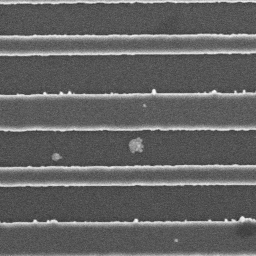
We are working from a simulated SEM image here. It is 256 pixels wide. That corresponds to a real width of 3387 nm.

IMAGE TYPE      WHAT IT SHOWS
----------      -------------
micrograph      lines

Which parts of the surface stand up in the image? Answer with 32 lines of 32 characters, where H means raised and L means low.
LLLLLLLLLLLLLLLLLLLLLLLLLLLLLLLL
LLLLLLLLLLLLLLLLLLLLLLLLLLLLLLLL
LLLLLLLLLLLLLLLLLLLLLLLLLLLLLLLL
LLLLLLLLLLLLLLLLLLLLLLLLLLLLLLLL
LLLLHLHLHHHHLHHHHHHHHHHHHHHHHHHH
HHHHHHHHHHHHHHHHHHHHHHHHHHHHHHHH
HHHHHHHHHHHHHHHHHHHHHHHHHHHHHHHH
LLLLLLLLLLLLLLLLLLLLLLLLLLLLLLLL
LLLLLLLLLLLLLLLLLLLLLLLLLLLLLLLL
LLLLLLLLLLLLLLLLLLLLLLLLLLLLLLLL
LLLLLLLLLLLLLLLLLLLLLLLLLLLLLLLL
LLLLLLLLLLLLLLLLLLLHLLLLLLLLLLLL
HHHHHHHHHHHHHHHHHHHHHHHHHHHHHHHH
HHHHHHHHHHHHHHHHHHHHHHHHHHHHHHHH
HHHHHHHHHHHHHHHHHHHHHHHHHHHHHHHH
HHHHHHHHHHHHHHHHHHHHHHHHHHHHHHHH
LLLLLLLLLLLLLLLLLLLLLLLLLLLLLLLL
LLLLLLLLLLLLLLLLLLLLLLLLLLLLLLLL
LLLLLLLLLLLLLLLLLLLLLLLLLLLLLLLL
LLLLLLLLLLLLLLLLLLLLLLLLLLLLLLLL
LLLLLLLLLLLLLLLLLLLLLLLLLLLLLLLL
HHHHHHHHHHHHHHHHHHHHHHHHHHHHHHHH
HHHHHHHHHHHHHHHHHHHHHHHHHHHHHHHH
LLLLLLLLLLLLLLLLLLLLLLLLLLLLLLLL
LLLLLLLLLLLLLLLLLLLLLLLLLLLLLLLL
LLLLLLLLLLLLLLLLLLLLLLLLLLLLLLLL
LLLLLLLLLLLLLLLLLLLLLLLLLLLLLLLL
LLLLLLLLLLLLLLLLLLLLLLLLLLLLLLHH
HHHHHHHHHHHHHHHHHHHHHHHHHHHHHHHH
HHHHHHHHHHHHHHHHHHHHHHHHHHHHHHHH
HHHHHHHHHHHHHHHHHHHHHHHHHHHHHHHH
HHHHHHHHHHHHHHHHHHHHHHHHHHHHHHHH